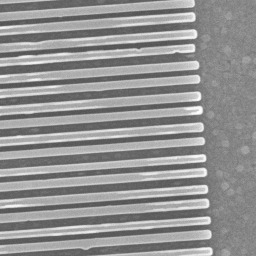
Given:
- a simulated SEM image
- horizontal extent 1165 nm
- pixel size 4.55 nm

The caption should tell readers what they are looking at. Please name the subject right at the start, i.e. parallel lines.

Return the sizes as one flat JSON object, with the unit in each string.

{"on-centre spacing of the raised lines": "70.5 nm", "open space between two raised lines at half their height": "31.2 nm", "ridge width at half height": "38.6 nanometres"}